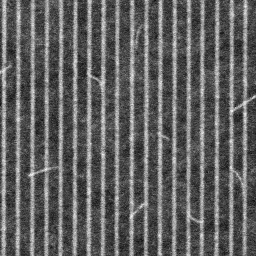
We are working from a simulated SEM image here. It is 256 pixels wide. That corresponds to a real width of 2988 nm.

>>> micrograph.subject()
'parallel lines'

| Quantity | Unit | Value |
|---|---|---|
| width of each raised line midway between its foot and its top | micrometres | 0.0263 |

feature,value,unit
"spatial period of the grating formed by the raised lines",165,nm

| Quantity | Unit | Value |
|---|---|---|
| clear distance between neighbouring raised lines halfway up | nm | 139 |